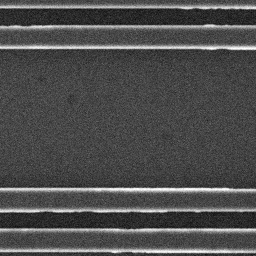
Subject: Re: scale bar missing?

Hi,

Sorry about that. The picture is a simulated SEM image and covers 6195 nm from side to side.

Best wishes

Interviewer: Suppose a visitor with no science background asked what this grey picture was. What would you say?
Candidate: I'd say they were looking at lines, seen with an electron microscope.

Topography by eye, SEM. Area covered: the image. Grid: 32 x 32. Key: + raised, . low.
++++++++++++++++++++++++++++++++
................................
................................
++++++++++++++++++++++++++++++++
++++++++++++++++++++++++++++++++
++++++++++++++++++++++++++++++++
................................
................................
................................
................................
................................
................................
................................
................................
................................
................................
................................
................................
................................
................................
................................
................................
................................
................................
++++++++++++++++++++++++++++++++
++++++++++++++++++++++++++++++++
................................
................................
................................
++++++++++++++++++++++++++++++++
++++++++++++++++++++++++++++++++
..............+....+++++++++++++